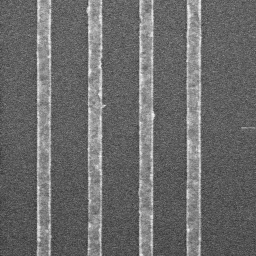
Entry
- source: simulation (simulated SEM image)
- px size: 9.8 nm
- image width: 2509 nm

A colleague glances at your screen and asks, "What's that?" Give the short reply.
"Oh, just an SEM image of parallel lines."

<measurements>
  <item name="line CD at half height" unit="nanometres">124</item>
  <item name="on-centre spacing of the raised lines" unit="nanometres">490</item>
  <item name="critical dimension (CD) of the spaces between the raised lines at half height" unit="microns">0.372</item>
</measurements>